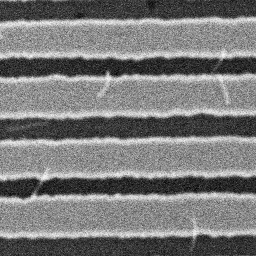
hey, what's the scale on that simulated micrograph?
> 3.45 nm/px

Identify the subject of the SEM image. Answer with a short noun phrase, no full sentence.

lines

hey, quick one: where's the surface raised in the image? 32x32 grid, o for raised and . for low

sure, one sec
................................
................................
..........ooo.o.oooo.ooooooooooo
oooooooooooooooooooooooooooooooo
oooooooooooooooooooooooooooooooo
oooooooooooooooooooooooooooooooo
oooooooooooooooooooooooooooooooo
................................
................................
......oo.....o.ooo..ooo.oooooooo
oooooooooooooooooooooooooooooooo
oooooooooooooooooooooooooooooooo
oooooooooooooooooooooooooooooooo
oooooooooooooooooooooooooooooooo
oooooooooooo.o..ooooo...........
................................
................................
.....o..oooooooooooooooooooooooo
oooooooooooooooooooooooooooooooo
oooooooooooooooooooooooooooooooo
oooooooooooooooooooooooooooooooo
oooooooooooooooooooooooooooooooo
o....o..........................
................................
....oooooooooooooooooooooooooooo
oooooooooooooooooooooooooooooooo
oooooooooooooooooooooooooooooooo
oooooooooooooooooooooooooooooooo
oooooooooooooooooooooooooooooooo
ooooooooooooooooooooo.oo..o.o...
................................
................................